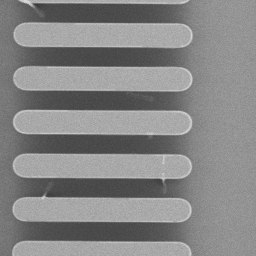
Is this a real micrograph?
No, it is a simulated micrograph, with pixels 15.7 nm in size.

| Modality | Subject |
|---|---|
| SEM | groups of lines, slits or small figures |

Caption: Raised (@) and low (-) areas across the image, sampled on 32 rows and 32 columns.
---@@---------------------------
--------------------------------
--------------------------------
--@@@@@@@@@@@@@@@@@@@@@@--------
--@@@@@@@@@@@@@@@@@@@@@@--------
--@@@@@@@@@@@@@@@@@@@@@---------
--------------------------------
--------------------------------
---@@@@@@@@@@@@@@@@@@@@---------
--@@@@@@@@@@@@@@@@@@@@@@--------
--@@@@@@@@@@@@@@@@@@@@@@--------
--------------------------------
--------------------------------
--------------------------------
--@@@@@@@@@@@@@@@@@@@@@@--------
--@@@@@@@@@@@@@@@@@@@@@@--------
---@@@@@@@@@@@@@@@@@@@@---------
--------------------------------
--------------------------------
--@@@@@@@@@@@@@@@@@@@@@---------
--@@@@@@@@@@@@@@@@@@@@@@--------
--@@@@@@@@@@@@@@@@@@@@@@--------
--------------------------------
--------------------------------
-----@--------------------------
--@@@@@@@@@@@@@@@@@@@@@@--------
--@@@@@@@@@@@@@@@@@@@@@@--------
---@@@@@@@@@@@@@@@@@@@@---------
--------------------------------
--------------------------------
--@@@@@@@@@@@@@@@@@@@@@---------
--@@@@@@@@@@@@@@@@@@@@@@--------